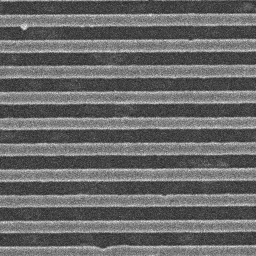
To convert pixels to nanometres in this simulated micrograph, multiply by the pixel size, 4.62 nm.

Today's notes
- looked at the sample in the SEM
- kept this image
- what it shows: parallel lines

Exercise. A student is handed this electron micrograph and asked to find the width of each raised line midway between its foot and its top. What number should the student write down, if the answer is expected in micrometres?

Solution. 0.0543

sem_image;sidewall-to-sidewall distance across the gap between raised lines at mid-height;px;13.7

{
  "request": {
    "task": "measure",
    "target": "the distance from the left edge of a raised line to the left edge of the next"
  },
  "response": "119 nanometers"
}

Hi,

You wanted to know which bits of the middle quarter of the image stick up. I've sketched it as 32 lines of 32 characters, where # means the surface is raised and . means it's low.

.................###############
################################
################################
##..............................
................................
................................
................................
################################
################################
################################
................................
................................
................................
.......##..#######.#####.##.##..
################################
################################
................................
................................
................................
................................
################################
################################
#############################.##
................................
................................
................................
################################
################################
################################
................................
................................
................................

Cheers